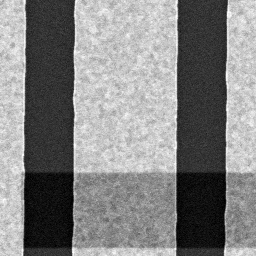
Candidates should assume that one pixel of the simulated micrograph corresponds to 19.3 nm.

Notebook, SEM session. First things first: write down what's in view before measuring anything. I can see wiring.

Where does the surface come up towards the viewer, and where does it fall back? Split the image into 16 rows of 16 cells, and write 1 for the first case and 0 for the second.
1100011111100011
1100011111100011
1100011111100011
1100011111100011
1100011111100011
1000011111100011
1000011111100011
1000011111100011
1000011111100011
1000011111100011
1000011111100011
1000011111100011
1000011111100011
1000011111100011
1000011111100011
1000011111100011